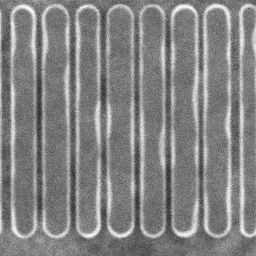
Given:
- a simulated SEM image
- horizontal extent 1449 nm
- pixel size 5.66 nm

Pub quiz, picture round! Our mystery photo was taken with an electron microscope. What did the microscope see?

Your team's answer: groups of lines, slits or small figures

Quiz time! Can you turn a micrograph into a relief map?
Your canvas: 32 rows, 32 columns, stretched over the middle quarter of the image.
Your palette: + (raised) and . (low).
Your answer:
+..++++++..++++++..++++++..+++++
+..++++++..++++++..++++++..+++++
+..++++++..++++++..++++++..+++++
+..++++++..++++++..++++++..+++++
+..++++++..++++++..++++++..+++++
+..++++++..++++++..++++++..+++++
+..++++++..++++++..++++++..+++++
+..++++++..++++++..++++++..+++++
+..++++++..++++++..++++++..+++++
+..++++++..++++++..++++++..+++++
+..++++++..++++++..++++++..+++++
+..+++++...++++++..++++++..+++++
+..+++++...++++++..++++++..+++++
+..+++++...++++++..++++++..+++++
+..+++++...++++++..++++++..+++++
+..+++++...++++++..++++++..+++++
+..++++++..++++++..++++++..+++++
+..++++++..++++++..++++++..+++++
+..++++++..++++++..++++++..+++++
+..++++++..++++++..++++++..+++++
+..++++++..++++++..++++++..+++++
+..++++++..++++++..++++++..+++++
+..++++++..++++++..++++++..+++++
+..++++++..++++++..++++++..+++++
+..++++++..++++++..++++++..+++++
+..++++++..++++++..++++++..+++++
+..++++++..++++++..++++++..+++++
+..++++++..++++++..++++++..+++++
+..++++++..++++++..++++++..+++++
+..++++++..++++++..++++++..+++++
+..++++++..++++++..++++++..+++++
+..++++++..++++++..++++++..+++++